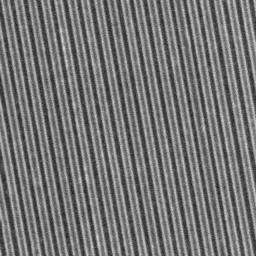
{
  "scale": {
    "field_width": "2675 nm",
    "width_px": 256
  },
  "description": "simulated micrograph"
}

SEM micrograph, parallel lines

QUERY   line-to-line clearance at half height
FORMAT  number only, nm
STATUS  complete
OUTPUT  54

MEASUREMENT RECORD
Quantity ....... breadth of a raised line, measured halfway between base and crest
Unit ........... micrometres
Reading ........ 0.0837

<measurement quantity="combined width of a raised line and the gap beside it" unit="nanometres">136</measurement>